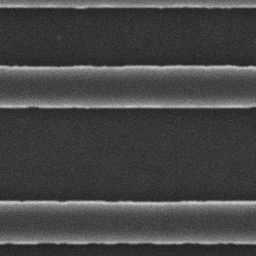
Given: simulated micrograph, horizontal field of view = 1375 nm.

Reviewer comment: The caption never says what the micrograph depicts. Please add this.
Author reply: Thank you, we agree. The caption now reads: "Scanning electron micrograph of lines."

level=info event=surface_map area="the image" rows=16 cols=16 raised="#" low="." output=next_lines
................
................
................
................
################
################
################
................
................
................
................
................
................
################
################
................